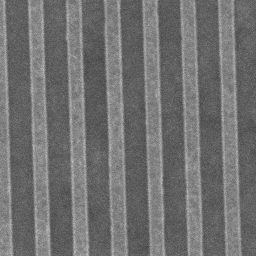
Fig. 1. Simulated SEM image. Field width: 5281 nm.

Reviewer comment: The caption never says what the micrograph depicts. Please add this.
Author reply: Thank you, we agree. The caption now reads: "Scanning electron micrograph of parallel lines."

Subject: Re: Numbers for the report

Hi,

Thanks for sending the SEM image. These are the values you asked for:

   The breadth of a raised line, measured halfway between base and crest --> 276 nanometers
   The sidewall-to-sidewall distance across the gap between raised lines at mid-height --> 518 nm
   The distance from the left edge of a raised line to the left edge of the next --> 784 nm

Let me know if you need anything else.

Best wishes